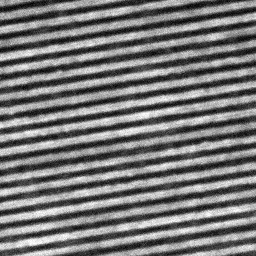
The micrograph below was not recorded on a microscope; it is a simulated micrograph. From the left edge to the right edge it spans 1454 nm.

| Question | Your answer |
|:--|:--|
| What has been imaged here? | parallel lines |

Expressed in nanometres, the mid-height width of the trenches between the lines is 47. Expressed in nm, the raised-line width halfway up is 25.9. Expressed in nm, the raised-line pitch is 76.